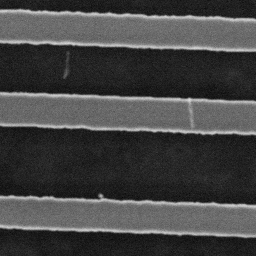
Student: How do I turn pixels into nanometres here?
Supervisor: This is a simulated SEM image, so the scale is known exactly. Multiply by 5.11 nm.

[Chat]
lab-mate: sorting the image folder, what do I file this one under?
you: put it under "lines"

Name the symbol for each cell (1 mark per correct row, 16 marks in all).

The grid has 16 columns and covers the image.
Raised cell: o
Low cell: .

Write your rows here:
................
oooooooooooooooo
oooooooooooooooo
................
................
................
oooooooooooooooo
oooooooooooooooo
................
................
................
................
ooooooo.........
oooooooooooooooo
.......ooooooooo
................